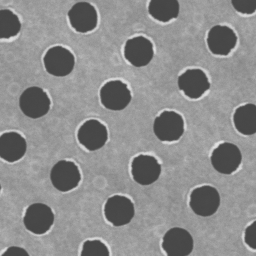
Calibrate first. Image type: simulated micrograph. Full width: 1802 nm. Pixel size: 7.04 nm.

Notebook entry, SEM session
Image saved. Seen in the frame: a regular array of holes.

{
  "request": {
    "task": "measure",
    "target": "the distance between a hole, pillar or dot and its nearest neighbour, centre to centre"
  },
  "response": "342 nanometres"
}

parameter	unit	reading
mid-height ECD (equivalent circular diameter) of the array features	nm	214